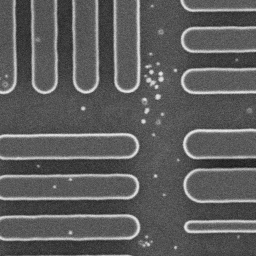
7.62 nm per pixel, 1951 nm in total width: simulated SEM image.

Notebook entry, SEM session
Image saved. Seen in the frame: groups of lines, slits or small figures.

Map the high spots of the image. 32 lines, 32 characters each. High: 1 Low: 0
11001110011100111000000111111111
11001110011100111000000000000000
11001110011100111000000000000000
11001110011100111000000000011111
11001110011100111000000111111111
11001110011100111000000111111111
11001110011100111000000000000000
11001110011100111000000000000000
11001110011100111000000000000000
11001110011100111000000111111111
11001110011100011000000111111111
10000100000000000000000011111100
00000000000000000000000000000000
00000000000000000000000000000000
00000000000000000000000000000000
00000000000000000000000000000000
00000000000000000000000011111111
11111111111111111000000111111111
11111111111111111000000111111111
11111111111111111000000011111111
00000000000000000000000000000000
00000000000000000000000011111111
11111111111111111000000111111111
11111111111111111000000111111111
11111111111111111000000011111111
00000000000000000000000000000000
00000000000000000000000000000000
11111111111111111000000000000000
11111111111111111000000111111111
11111111111111111000000000000000
00000000000000000000000000000000
00000000000000000000000000000000